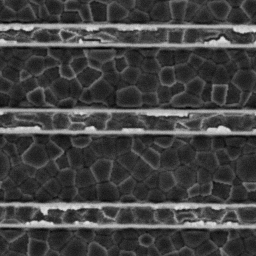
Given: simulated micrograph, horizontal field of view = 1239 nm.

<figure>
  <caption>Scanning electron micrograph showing one or a few lines or trenches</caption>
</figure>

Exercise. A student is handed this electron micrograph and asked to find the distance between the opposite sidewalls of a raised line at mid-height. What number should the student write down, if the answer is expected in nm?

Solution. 105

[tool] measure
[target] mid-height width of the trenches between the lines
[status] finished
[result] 330 nm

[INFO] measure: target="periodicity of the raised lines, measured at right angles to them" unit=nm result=435